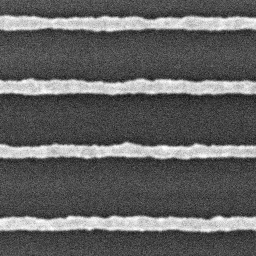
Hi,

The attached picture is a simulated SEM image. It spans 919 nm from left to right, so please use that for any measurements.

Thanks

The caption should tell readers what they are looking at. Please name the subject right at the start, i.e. lines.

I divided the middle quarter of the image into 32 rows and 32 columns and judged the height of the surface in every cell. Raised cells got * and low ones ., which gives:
................................
................................
................................
................................
*****...........***************.
********************************
********************************
................................
................................
................................
................................
................................
................................
................................
................................
................................
................................
................................
................................
................................
***....*....*******.............
********************************
********************************
.....*..................**...**.
................................
................................
................................
................................
................................
................................
................................
................................